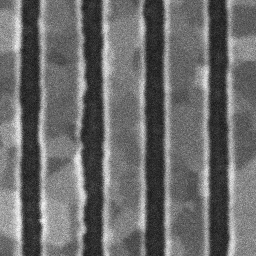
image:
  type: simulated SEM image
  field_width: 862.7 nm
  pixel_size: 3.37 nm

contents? one or a few lines or trenches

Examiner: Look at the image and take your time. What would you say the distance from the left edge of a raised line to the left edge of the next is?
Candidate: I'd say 62.5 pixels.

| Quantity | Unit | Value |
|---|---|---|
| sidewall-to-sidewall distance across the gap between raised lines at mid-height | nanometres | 75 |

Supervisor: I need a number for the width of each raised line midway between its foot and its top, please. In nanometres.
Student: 136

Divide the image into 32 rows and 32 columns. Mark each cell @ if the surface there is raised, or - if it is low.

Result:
@@---@@@@@---@@@@@---@@@@@---@@@
@@---@@@@@---@@@@@---@@@@@---@@@
@@---@@@@@---@@@@@---@@@@@---@@@
@@---@@@@@---@@@@@---@@@@@---@@@
@@---@@@@@---@@@@@---@@@@@---@@@
@@---@@@@@---@@@@@---@@@@@---@@@
@@---@@@@@---@@@@@---@@@@@---@@@
@@---@@@@@---@@@@@---@@@@@---@@@
@@---@@@@@---@@@@@---@@@@@---@@@
@@---@@@@@---@@@@@---@@@@@---@@@
@@---@@@@@@--@@@@@---@@@@@---@@@
@@---@@@@@---@@@@@---@@@@@---@@@
@@---@@@@@---@@@@@---@@@@@---@@@
@@---@@@@@---@@@@@---@@@@@---@@@
@@---@@@@@---@@@@@---@@@@@---@@@
@@---@@@@@---@@@@@---@@@@@---@@@
@@---@@@@@---@@@@@---@@@@@---@@@
@@---@@@@@---@@@@@---@@@@@---@@@
@@---@@@@@---@@@@@---@@@@@---@@@
@@---@@@@@---@@@@@---@@@@@---@@@
@@---@@@@@---@@@@@---@@@@@---@@@
@@---@@@@@---@@@@@---@@@@@---@@@
@@---@@@@@---@@@@@---@@@@@---@@@
@@---@@@@@---@@@@@---@@@@@---@@@
@@---@@@@@@--@@@@@---@@@@@---@@@
@@---@@@@@---@@@@@---@@@@@---@@@
@@---@@@@@---@@@@@---@@@@@---@@@
@@---@@@@@---@@@@@---@@@@@---@@@
@@----@@@@---@@@@@---@@@@@---@@@
@@@--@@@@@---@@@@@---@@@@@---@@@
@@@--@@@@@---@@@@@---@@@@@---@@@
@@@--@@@@@---@@@@@---@@@@@---@@@